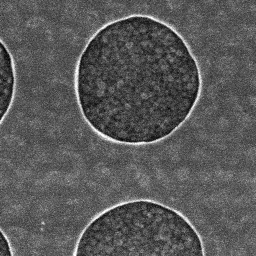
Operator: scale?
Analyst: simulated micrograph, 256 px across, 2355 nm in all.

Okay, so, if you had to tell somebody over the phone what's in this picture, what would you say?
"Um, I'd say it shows holes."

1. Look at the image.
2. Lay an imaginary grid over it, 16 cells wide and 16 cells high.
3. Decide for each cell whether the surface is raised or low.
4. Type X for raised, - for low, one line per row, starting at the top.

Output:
XXXXXXXXXXXXXXXX
XXXXXXX---XXXXXX
XXXXXX-----XXXXX
-XXXX-------XXXX
-XXXX-------XXXX
-XXXX-------XXXX
-XXXX-------XXXX
XXXXX------XXXXX
XXXXXXX---XXXXXX
XXXXXXXXXXXXXXXX
XXXXXXXXXXXXXXXX
XXXXXXXXXXXXXXXX
XXXXXXXXXXXXXXXX
XXXXXX-----XXXXX
XXXXX-------XXXX
-XXXX--------XXX